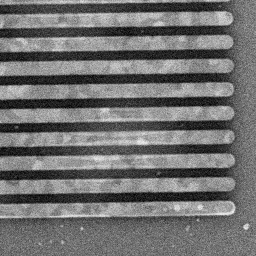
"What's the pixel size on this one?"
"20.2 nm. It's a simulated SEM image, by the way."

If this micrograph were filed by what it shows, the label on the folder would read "groups of lines, slits or small figures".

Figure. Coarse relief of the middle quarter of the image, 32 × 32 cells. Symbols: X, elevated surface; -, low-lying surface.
XXXXXXXXXXXXXXXXXXXXXXXXXXXXXXXX
XXXXXXXXXXXXXXXXXXXXXXXXXXXXXXXX
XX------------------------------
--------------------------------
--------------------------------
XXXXXXXXXXXXXXXXXXXXXXXXXXXXXXXX
XXXXXXXXXXXXXXXXXXXXXXXXXXXXXXXX
XXXXXXXXXXXXXXXXXXXXXXXXXXXXXXXX
XXXXXX--------------------------
--------------------------------
--------------------------------
XXXXXXXXXXXXXXXXXXXXXXXXXXXXXXXX
XXXXXXXXXXXXXXXXXXXXXXXXXXXXXXXX
XXXXXXXXXXXXXXXXXXXXXXXXXXXXXXXX
--------------------------------
--------------------------------
--------------------------------
XXXXXXXXXX----XXXXXXXXXXXXXXXXXX
XXXXXXXXXXXXXXXXXXXXXXXXXXXXXXXX
XXXXXXXXXXXXXXXXXXXXXXXXXXXXXXXX
--------------------------------
--------------------------------
--------------------------------
XXXXXXXXXXXXXXXXXXXXXXXXXXXXXXXX
XXXXXXXXXXXXXXXXXXXXXXXXXXXXXXXX
XXXXXXXXXXXXXXXXXXXXXXXXXXXXXXXX
--------------------------------
--------------------------------
--------------------------------
XXXXXXXXXXXXXXXXXXXXXXXXXXXXXXXX
XXXXXXXXXXXXXXXXXXXXXXXXXXXXXXXX
XXXXXXXXXXXXXXXXXXXXXXXXXXXXXXXX